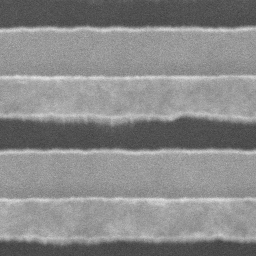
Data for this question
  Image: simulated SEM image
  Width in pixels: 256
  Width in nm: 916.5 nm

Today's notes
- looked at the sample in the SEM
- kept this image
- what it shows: lines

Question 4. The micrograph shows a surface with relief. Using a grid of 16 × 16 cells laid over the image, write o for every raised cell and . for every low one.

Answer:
................
................
oooooooooooooooo
oooooooooooooooo
oooooooooooooooo
oooooooooooooooo
oooooooooooooooo
................
................
oooooooo.oooooo.
oooooooooooooooo
oooooooooooooooo
oooooooooooooooo
oooooooooooooooo
oooooooooooooooo
................